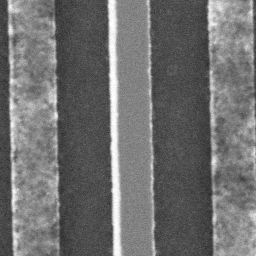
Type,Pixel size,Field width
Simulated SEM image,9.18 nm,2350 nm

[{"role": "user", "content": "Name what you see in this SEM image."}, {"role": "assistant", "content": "lines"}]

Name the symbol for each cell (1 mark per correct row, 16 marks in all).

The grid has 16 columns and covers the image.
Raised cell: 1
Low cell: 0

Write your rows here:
0110000110000111
0110000110000111
0110000110000111
0110000110000111
0110000110000111
0110000110000111
0110000110000111
0111000110000111
0111000110000111
0111000111000111
0111000111000111
0111000111000111
0111000111000111
0111000111000111
0111000111000111
0111000111000111